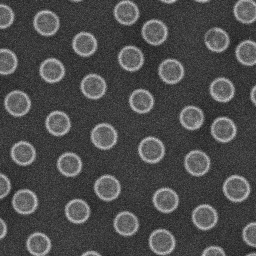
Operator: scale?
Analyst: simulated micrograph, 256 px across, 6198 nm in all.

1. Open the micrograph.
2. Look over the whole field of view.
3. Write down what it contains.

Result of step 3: a regular array of raised bodies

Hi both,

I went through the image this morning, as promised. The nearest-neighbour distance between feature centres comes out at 1020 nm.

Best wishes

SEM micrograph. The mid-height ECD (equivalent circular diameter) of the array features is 548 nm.